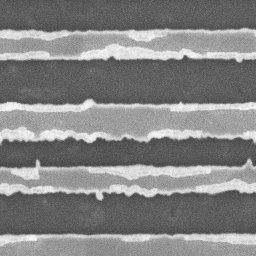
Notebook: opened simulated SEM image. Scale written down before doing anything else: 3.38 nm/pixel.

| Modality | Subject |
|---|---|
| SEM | one or a few lines or trenches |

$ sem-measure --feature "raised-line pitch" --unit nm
228